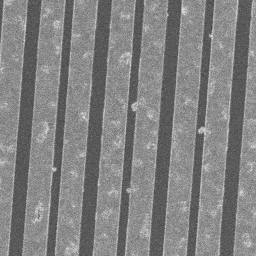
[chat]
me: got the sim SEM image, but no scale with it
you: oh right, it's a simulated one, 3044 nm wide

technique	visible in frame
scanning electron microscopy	parallel lines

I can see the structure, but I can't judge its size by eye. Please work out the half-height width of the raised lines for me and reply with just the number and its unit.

276 nanometers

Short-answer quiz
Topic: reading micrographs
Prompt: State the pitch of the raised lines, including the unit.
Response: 411 nanometers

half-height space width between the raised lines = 167 nanometers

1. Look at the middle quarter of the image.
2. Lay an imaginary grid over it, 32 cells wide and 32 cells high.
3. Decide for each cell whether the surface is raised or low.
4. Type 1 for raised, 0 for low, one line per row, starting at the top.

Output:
01111110000111111001111110001111
01111110000111111001111110001111
01111110000111110001111110001111
01111110000111110001111100001111
01111110000111110001111100001111
01111110000111110001111100001111
01111110000111110001111100001111
01111100001111110001111100001111
01111100001111110011111100001111
01111100001111110011111100001111
01111100001111110011111100001111
01111100001111110011111100001111
11111100001111110011111100011111
11111100001111110011111100011111
11111100001111110011111100011111
11111100001111100011111100011111
11111100001111100011111000011111
11111100001111100011111000011111
11111100001111100011111000011111
11111100001111100011111000011111
11111100011111100011111000011111
11111000011111100111111000011111
11110000011111100111111000011111
11111000011111100111111000011111
11111000011111100111111000011111
11111000011111100111111000011111
11111000011111100111111000111111
11111000011111100111111000111111
11111000011111000111111000111111
11111000011111000111110000111111
11111000011111000111110000111111
11111000011111000111110000111111